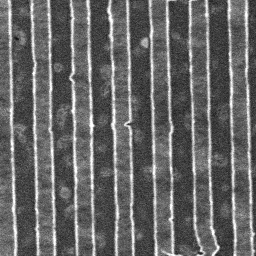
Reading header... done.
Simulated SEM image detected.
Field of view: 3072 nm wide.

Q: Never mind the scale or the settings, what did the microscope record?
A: parallel lines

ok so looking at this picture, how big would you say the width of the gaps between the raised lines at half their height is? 259 nanometers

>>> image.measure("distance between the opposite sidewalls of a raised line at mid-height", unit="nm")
216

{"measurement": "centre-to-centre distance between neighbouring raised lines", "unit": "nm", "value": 473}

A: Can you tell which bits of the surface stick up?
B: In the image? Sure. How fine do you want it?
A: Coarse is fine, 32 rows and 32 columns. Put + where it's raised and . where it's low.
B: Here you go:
+...++...++...++...++...++...++.
+...++...++...++...++...++...++.
+...++...++...++...++...++...++.
+...++...++...++...++...++...++.
+...++...++...++...++...++...++.
+...++...++...++...++...++...++.
+...++...++...++...++...++...++.
+...++...++...++...++...++...++.
+...++...++...++...++...++...++.
+...++...++...++...++...++...++.
+...++...++...++...++...++...++.
+...++...++...++...++...++...++.
++..++...++...++...++...++...++.
++..++...++...++...++...++...++.
++..++...++...++...++...++...++.
+...++...+++..++...++...++...++.
++..++...+++..++...++...++...++.
++..++...++...++...++...++...++.
++..+++..++...++...++...++...++.
++..+++..++...++...++...++...++.
++...++..+++..++...++...++...++.
++...++..+++..+++..++...++...++.
++...++..+++..+++..+++..++...++.
++..+++..+++..+++..+++..++...++.
++...++..+++..++...+++..++...++.
++...++..+++..++...++...+++..++.
++...++...++...++..+++..++...++.
++...++..+++...++..++...++...++.
++...++..+++...++..+++..+++..+++
++...++...++..+++..+++...++..+++
++...++...++..+++..+++...++..++.
++...++...++..+++..+++...++..+++